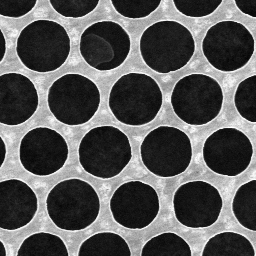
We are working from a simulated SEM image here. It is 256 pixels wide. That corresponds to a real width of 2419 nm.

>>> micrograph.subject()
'a regular array of holes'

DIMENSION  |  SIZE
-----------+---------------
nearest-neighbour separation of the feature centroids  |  575 nm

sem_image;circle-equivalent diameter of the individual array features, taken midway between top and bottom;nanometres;487